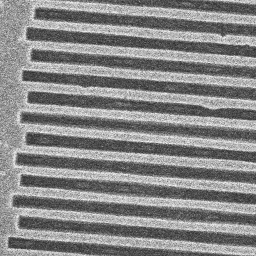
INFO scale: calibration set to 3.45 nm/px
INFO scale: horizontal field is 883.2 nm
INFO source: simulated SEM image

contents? parallel lines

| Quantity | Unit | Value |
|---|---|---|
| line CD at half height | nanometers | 33.5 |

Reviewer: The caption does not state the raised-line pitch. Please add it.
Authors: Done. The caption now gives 72.4 nm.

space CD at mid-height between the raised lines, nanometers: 36.5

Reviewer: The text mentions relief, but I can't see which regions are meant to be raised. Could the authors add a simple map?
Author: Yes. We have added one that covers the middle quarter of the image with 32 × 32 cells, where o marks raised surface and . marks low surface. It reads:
oooooooo........................
oooooooooooooooooo..............
..oooooooooooooooooooooooooooooo
...............ooooooooooooooooo
...........................oo.oo
oooo............................
ooooooooooooooooooo.............
.oooooooooooooooooooooooooooo...
..............oooooooooooooooooo
.......................ooooooooo
................................
oooooooooo.oo...................
ooooooooooooooooooooooooo.......
..........oooooooooooooooooooooo
......................oooooooooo
................................
oooooooooooo....................
ooooooooooooooooooooo...........
......oooooooooooooooooooooooooo
..................oooooooooooooo
...............................o
oooooooo........................
oooooooooooooooooooo............
.....ooooooooooooooooooooooooooo
.................ooooooooooooooo
.............................ooo
oooo............................
oooooooooooooooo................
.oooooooooooooooooooooooooooo...
................oooooooooooooooo
..........................oooooo
o...............................